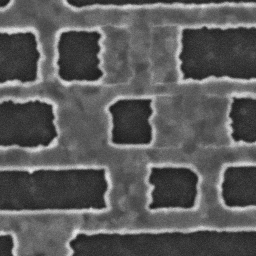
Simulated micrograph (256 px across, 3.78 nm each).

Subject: one or a few lines or trenches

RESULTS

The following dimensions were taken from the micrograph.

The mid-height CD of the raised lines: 82.7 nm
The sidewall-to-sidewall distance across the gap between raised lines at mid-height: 180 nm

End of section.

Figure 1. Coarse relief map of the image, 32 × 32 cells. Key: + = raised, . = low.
.++++++++.......................
++++++++++++++++++++++++++++++++
++++++++++++++++++++++++++++++++
+++++++++++++++++++++++.........
.....++......++++++++++.........
.....++......++++++++++.........
.....++......+++++++++..........
.....++......+++++++++..........
.....++......+++++++++..........
.....++......++++++++++.........
+++.++++++++++++++++++++++++++++
++++++++++++++++++++++++++++++++
..+..+++++++++.....++++++++++...
.......++++++......++++++++++...
.......+++++++.....++++++++++...
.......+++++++.....++++++++++...
.......+++++++.....++++++++++...
.......+++++++.....++++++++++...
.++..+++++++++++++++++++++++++++
++++++++++++++++++++++++++++++++
++++++++++++++++++++++++++++++++
.............++++++.....++++....
..............++++.......+++....
..............+++++......++.....
.............++++++......+++....
.............++++++......+++....
.....+++++++++++++++++++++++++++
++++++++++++++++++++++++++++++++
++++++++++++++++++++++++++++++++
..+++++++.......................
..+++++++.......................
..+++++++.......................